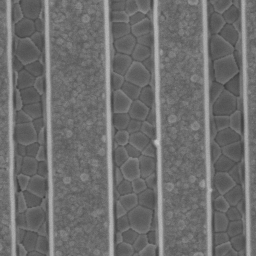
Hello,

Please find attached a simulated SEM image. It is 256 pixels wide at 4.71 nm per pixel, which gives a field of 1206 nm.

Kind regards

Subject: one or a few lines or trenches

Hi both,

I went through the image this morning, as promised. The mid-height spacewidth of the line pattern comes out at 177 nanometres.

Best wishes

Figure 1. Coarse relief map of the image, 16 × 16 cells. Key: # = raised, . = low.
#..####...###..#
#..####...###..#
#..####...###..#
#..####...###..#
#..####...###..#
#..####...###..#
#..####...###..#
#..####...###..#
#..####...###..#
#..####...###..#
#..####...###..#
#..####...###..#
#..####...###..#
#..####...###..#
#..####...###..#
#..####...###..#